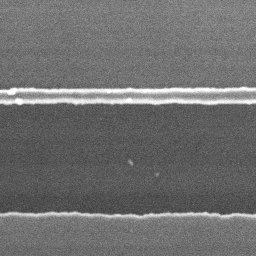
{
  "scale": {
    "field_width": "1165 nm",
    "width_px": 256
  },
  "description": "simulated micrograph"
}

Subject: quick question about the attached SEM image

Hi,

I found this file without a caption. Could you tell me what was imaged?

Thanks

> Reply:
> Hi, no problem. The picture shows lines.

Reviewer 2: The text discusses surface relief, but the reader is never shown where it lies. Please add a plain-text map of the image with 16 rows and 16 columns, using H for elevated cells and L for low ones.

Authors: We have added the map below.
HHHHHHHHHHHHHHHH
HHHHHHHHHHHHHHHH
HHHHHHHHHHHHHHHH
HHHHHHHHHHHHHHHH
HHHHHHHHHHHHHHHH
HHHHHHHHHHHHHHHH
LLLLLLLLLLLLLHLL
LLLLLLLLLLLLLLLL
LLLLLLLLLLLLLLLL
LLLLLLLLLLLLLLLL
LLLLLLLLLLLLLLLL
LLLLLLLLLLLLLLLL
LLLLLLLLLLLLLLLL
HHHHHHHHHHHHHHHH
HHHHHHHHHHHHHHHH
HHHHHHHHHHHHHHHH